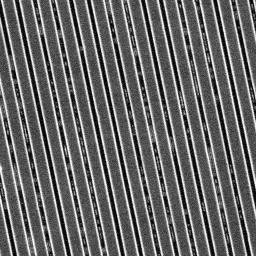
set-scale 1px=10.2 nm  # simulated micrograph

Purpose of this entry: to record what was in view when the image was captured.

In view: parallel lines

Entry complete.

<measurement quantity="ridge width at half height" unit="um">0.129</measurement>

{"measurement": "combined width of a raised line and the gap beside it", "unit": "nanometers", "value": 181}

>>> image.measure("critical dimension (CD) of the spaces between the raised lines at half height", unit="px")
4.89